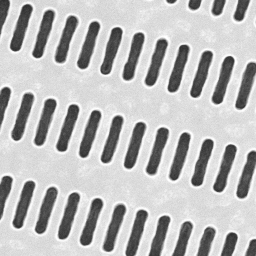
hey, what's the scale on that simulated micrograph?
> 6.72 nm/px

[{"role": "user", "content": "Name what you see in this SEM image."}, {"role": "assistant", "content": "a regular array of holes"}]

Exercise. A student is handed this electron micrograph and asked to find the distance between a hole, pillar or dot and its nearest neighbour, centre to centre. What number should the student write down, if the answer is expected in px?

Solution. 23.2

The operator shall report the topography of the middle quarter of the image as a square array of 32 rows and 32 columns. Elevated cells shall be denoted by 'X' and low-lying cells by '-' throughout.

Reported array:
XXX---XXX---XXX---XXX---XXX---XX
XXXXXXXXX---XXX---XXX---XXX---XX
XXXXXXXXXX-XXXX---XXX---XXX---XX
XXXXXXXXXXXXXXX--XXX----XX----XX
XXXXXXXXXXXXXXXXXXXX---XXX---XXX
XXXXXXXXXXXXXXXXXXXXX-XXXX---XXX
XXXXXXXXXXXXXXXXXXXXXXXXXX--XXXX
XXXXXXXXXXXXXXXXXXXXXXXXXXXXXXXX
XXXXXXXXXXXXXXXXXXXXXXXXXXXXXXXX
XXXXXXXXXXXXXXXXXXXXXXXXXXXXXXXX
X---XXXXXXXXXXXXXXXXXXXXXXXXXXXX
X---XXXXXXXXXXXXXXXXXXXXXXXXXXXX
X---XXX--XXXXXXXXXXXXXXXXXXXXXXX
---XXX---XXX---XXXXXXXXXXXXXXXXX
---XXX---XXX---XXXX-XXXXXXXXXXXX
---XX----XXX---XXX---XXXXXXXXXXX
--XXX---XXX---XXX---XXX---XXXXXX
--XXX---XXX---XXX---XXX---XXX--X
--XXX---XXX---XXX---XXX---XXX---
-XXX---XXX---XXX---XXX----XX---X
-XXX---XXX---XXX---XXX---XXX---X
-XXX---XXX---XXX---XXX---XXX---X
XXXX--XXX----XX----XXX---XXX---X
XXXXXXXXX---XXX---XXX---XXX----X
XXXXXXXXXX--XXX---XXX---XXX---XX
XXXXXXXXXXXXXXX--XXXX---XXX---XX
XXXXXXXXXXXXXXXXXXXX---XXXX--XXX
XXXXXXXXXXXXXXXXXXXXX--XXX---XXX
XXXXXXXXXXXXXXXXXXXXXXXXXX--XXXX
XXXXXXXXXXXXXXXXXXXXXXXXXXXXXXXX
XXXXXXXXXXXXXXXXXXXXXXXXXXXXXXXX
XXXXXXXXXXXXXXXXXXXXXXXXXXXXXXXX